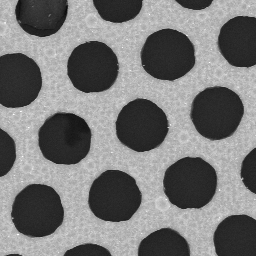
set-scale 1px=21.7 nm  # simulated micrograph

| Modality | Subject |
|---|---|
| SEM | a regular array of holes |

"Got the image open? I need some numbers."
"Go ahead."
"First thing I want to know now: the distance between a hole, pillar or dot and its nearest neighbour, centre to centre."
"1640 nanometres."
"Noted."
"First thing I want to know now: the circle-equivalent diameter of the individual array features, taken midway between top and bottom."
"1.15 µm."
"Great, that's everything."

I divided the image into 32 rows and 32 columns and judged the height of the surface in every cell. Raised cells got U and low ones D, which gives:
UUDDDDDDUUUUDDDDDDUUUUDDDDUUUUUU
UUDDDDDDUUUUDDDDDUUUUUUUUUUUUUUU
UUDDDDDDUUUUUDDDUUUUUUUUUUUUUDDD
UUUDDDDDUUUUUUUUUUUUUUUUUUUUDDDD
UUUUUDUUUUUUUUUUUUUDDDDUUUUDDDDD
UUUUUUUUUUDDDUUUUUDDDDDDUUUDDDDD
UUUUUUUUUDDDDDUUUUDDDDDDUUUUDDDD
DDDDUUUUUDDDDDDUUUDDDDDDUUUUDDDD
DDDDDUUUDDDDDDDUUUDDDDDDUUUUUUUU
DDDDDUUUUDDDDDDUUUUDDDDUUUUUUUUU
DDDDDUUUUDDDDDUUUUUUUUUUUUUUUUUU
DDDDDUUUUUDDUUUUUUUUUUUUUDDDDUUU
DDDDUUUUUUUUUUUUUDUUUUUUDDDDDDUU
UUUUUUUUUUUUUUUDDDDDUUUUDDDDDDUU
UUUUUUUDDDUUUUUDDDDDDUUUDDDDDDUU
UUUUUDDDDDDUUUDDDDDDDUUUDDDDDDUU
DUUUUDDDDDDUUUUDDDDDDUUUUDDDDUUU
DDUUUDDDDDDUUUUDDDDDUUUUUUUUUUUU
DDUUUDDDDDDUUUUUDDDUUUUUUUUUUUUU
DDUUUUDDDDDUUUUUUUUUUUUUUUUUUUUD
DDUUUUUDDUUUUUUUUUUUUUDDDDUUUUDD
DUUUUUUUUUUUUDDUUUUUUDDDDDDUUUDD
UUUUUUUUUUUUDDDDDUUUDDDDDDDUUUDD
UUUDDDDUUUUDDDDDDUUUDDDDDDDUUUUD
UUDDDDDUUUUDDDDDDDUUUDDDDDDUUUUU
UUDDDDDDUUUDDDDDDDUUUUDDDDUUUUUU
UDDDDDDDUUUUDDDDDUUUUUUUUUUUUUUU
UDDDDDDDUUUUUDDDUUUUUUUUUUUUDDDD
UUDDDDDUUUUUUUUUUUUUUUUUUUUDDDDD
UUUUDDUUUUUUUUUUUUDDDDDUUUUDDDDD
UUUUUUUUUUUDUUUUUUDDDDDUUUUDDDDD
UUUUUUUUDDDDDDUUUDDDDDDDUUUDDDDD